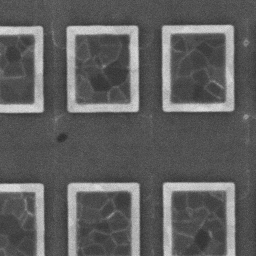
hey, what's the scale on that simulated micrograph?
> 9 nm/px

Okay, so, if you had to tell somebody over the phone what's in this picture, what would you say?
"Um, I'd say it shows wiring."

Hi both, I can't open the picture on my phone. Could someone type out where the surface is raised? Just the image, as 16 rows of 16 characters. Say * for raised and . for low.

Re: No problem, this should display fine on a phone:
................
................
**..****..****..
**..****..****..
**..****..****..
**..****..****..
**...***...***..
................
................
................
................
................
**...***..****..
**...***..****..
**...***..****..
**...***..****..